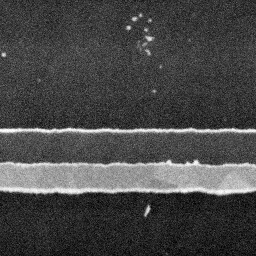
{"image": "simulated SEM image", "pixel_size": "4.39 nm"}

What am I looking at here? lines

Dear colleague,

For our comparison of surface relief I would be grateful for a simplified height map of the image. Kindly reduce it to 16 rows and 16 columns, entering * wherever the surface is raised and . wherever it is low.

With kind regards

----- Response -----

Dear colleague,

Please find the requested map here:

................
................
................
................
................
................
................
................
****************
****************
****************
****************
................
................
................
................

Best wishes